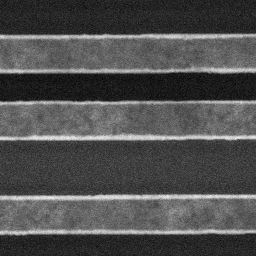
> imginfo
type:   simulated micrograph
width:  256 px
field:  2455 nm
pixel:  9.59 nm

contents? lines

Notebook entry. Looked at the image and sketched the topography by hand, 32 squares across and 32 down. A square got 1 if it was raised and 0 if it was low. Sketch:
00000000000000000000000000000000
00000000000000000000000000000000
00000000000000000000000000000000
00000000000000000000000000000000
11111111111111111111111111111111
11111111111111111111111111111111
11111111111111111111111111111111
11111111111111111111111111111111
11111111111111111111111111111111
00000000000000000000000000000000
00000000000000000000000000000000
00000000000000000000000000000000
00000000000000000000000000000000
11111111111111111111111111111111
11111111111111111111111111111111
11111111111111111111111111111111
11111111111111111111111111111111
00000000000000000000000000000000
00000000000000000000000000000000
00000000000000000000000000000000
00000000000000000000000000000000
00000000000000000000000000000000
00000000000000000000000000000000
00000000000000000000000000000000
00000000000000000000000001111111
11111111111111111111111111111111
11111111111111111111111111111111
11111111111111111111111111111111
11111111111111111111111111111111
00000000000000000000000000000000
00000000000000000000000000000000
00000000000000000000000000000000